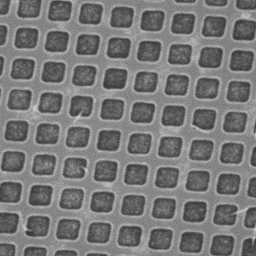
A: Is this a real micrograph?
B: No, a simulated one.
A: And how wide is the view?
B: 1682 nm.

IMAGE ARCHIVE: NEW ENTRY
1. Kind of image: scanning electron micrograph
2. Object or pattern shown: a regular array of holes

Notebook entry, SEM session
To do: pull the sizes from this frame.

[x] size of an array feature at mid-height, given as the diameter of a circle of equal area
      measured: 0.159 µm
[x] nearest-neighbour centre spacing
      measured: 202 nm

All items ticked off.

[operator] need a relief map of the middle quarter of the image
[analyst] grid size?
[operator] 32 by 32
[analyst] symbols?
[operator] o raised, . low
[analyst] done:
ooo....ooooooooooooooooooooooooo
oo......ooo.....oooooooooooooooo
oo......oo......oo.....oooo.oooo
oo......oo......oo......oo.....o
oo......oo......oo......o......o
ooo...oooo.....oo......oo......o
oooooooooooooooooo.....oo......o
oooooooooooooooooooooooooo.....o
oo.....ooooooooooooooooooooooooo
oo.....ooo.....ooo..oooooooooooo
o......oo......oo......ooo....oo
o......oo......oo......oo.....oo
o......oo......oo......oo.....oo
ooooooooo.....ooo.....oo......oo
ooooooooooooooooo.....oo......oo
ooooooooooooooooooooooooo....ooo
o.....ooooo..ooooooooooooooooooo
o......oo.....ooo....ooooooooooo
......oo......oo......oo.....ooo
......oo......oo......oo......oo
o.....oo......oo......oo......oo
ooooooooo....ooo......o......oo.
ooooooooooooooooo....ooo.....oo.
o....ooooooooooooooooooooo.oooo.
......oo.....ooooooooooooooooooo
......oo......oo.....ooooooooooo
.....ooo.....oo......oo......ooo
.....oo......oo......oo......oo.
.....oo......oo......oo......oo.
ooooooooo.o.ooo.....ooo.....oo..
ooooooooooooooooooooooo.....oo..
.....oooooooooooooooooooooooooo.